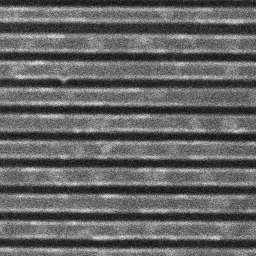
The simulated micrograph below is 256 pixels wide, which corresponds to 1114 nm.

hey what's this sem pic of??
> parallel lines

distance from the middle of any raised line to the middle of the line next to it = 26.9 pixels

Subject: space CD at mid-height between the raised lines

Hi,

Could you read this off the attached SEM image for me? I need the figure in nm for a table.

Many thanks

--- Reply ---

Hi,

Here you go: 42.2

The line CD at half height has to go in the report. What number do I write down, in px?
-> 17.5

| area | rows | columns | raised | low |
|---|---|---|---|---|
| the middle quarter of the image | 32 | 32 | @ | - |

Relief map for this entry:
@@@@@@@@@@@@@@@@@@@@@@@@@@@@@@@@
@@@@@@@@@@@@@@@@@@@@@@@@@@@@@@@@
@@@@@@@@@@@@@@@@@@@@@@@@@@@@@@@@
@@@@@@@@@@@@@@@@@@@@@@@@@@@@@@@@
--------------------------------
--------------------------------
@@@@@@@@@@@@@@@@@@@@@@@@@@@@@@@@
@@@@@@@@@@@@@@@@@@@@@@@@@@@@@@@@
@@@@@@@@@@@@@@@@@@@@@@@@@@@@@@@@
@@@@@@@@@@@@@@@@@@@@@@@@@@@@@@@@
--------------------------------
--------------------------------
--------------------------------
@@@@@@@@@@@@@@@@@@@@@@@@@@@@@@@@
@@@@@@@@@@@@@@@@@@@@@@@@@@@@@@@@
@@@@@@@@@@@@@@@@@@@@@@@@@@@@@@@@
@@@@@@@@@@@@@@@@@@@@@@@@@@@@@@@@
--------------------------------
--------------------------------
@@@@@@@@@@@@@@@@@---@@@@@@@@@@@@
@@@@@@@@@@@@@@@@@@@@@@@@@@@@@@@@
@@@@@@@@@@@@@@@@@@@@@@@@@@@@@@@@
@@@@@@@@@@@@@@@@@@@@@@@@@@@@@@@@
-------@@@@@@@@@@@@@@@@@@@@@@@@@
--------------------------------
--------------------------------
@@@@@@@@@@@@@@@@@@@@@@@@@@@@@@@@
@@@@@@@@@@@@@@@@@@@@@@@@@@@@@@@@
@@@@@@@@@@@@@@@@@@@@@@@@@@@@@@@@
@@@@@@@@@@@@@@@@@@@@@@@@@@@@@@@@
--------------------------------
--------------------------------